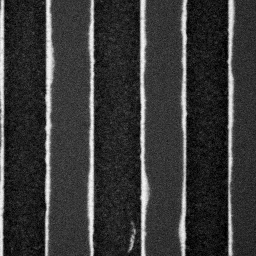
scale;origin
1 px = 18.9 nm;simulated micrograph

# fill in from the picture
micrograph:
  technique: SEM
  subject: lines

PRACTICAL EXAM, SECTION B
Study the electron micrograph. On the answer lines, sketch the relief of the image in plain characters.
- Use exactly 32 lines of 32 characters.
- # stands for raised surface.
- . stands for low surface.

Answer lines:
......######......#####......###
......######......#####......###
......######......#####......###
......######......#####......###
......######......#####......###
......######......#####......###
......######......#####......###
......######......#####......###
......######......#####......###
......######......#####......###
......######......#####......###
......######......#####......###
......######......#####......###
......######......#####......###
......######......#####......###
......######......#####......###
......######......#####......###
......######......#####......###
......######......#####......###
......######......#####......###
......######......#####......###
......######......#####......###
......######......#####......###
......######......#####......###
......######......#####......###
......######......#####......###
......######......#####......###
......######......#####......###
......######......#####......###
......######......#####......###
......######......#####......###
......######......#####......###